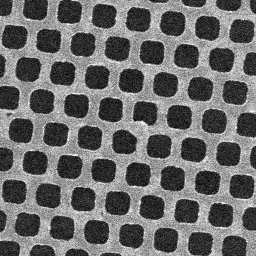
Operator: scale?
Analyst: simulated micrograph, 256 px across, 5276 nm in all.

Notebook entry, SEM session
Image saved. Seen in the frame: a regular array of holes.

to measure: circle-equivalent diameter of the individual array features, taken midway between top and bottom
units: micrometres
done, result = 0.553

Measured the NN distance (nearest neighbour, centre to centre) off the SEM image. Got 712 nm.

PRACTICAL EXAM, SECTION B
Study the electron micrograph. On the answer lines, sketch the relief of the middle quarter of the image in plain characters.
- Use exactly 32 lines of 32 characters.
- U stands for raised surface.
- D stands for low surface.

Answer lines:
DDDUUUDDDDUUUUUUUUUUUUUUUUUUDDDD
DDDUUDDDDDDUUUUDDDDUUUUUUUUUUUUU
DDDUUDDDDDDDUUDDDDDDUUUDDDDDUUUU
DDDUUDDDDDDUUUDDDDDDUUDDDDDDUUUU
DDDUUDDDDDDUUUDDDDDDUUDDDDDDDDUD
DUUUUDDDDDDUUDDDDDDDUUDDDDDDDDUD
UUUUUUUUDDUUUUDDDDDDUUDDDDDDDUUD
UDDDDUUUUUUUUUUDDDUUUUUDDDDDUUUD
DDDDDDUUUUDDDUUDUUUUUUUUUUUUUUUD
DDDDDDUUUDDDDDDUUUDDDDUUUUUUUUUU
DDDDDDUUUDDDDDDUUDDDDDDUUUUDDDDU
DDDDDDUUDDDDDDDUUDDDDDDDUUDDDDDD
DDDDDDUUDDDDDDDUUDDDDDDUUUDDDDDD
UUDDDUUUUDDDDDDUUDDDDDDUUUDDDDDD
UUUUUUUUUUDDDDUUUUDUDDDUUUDDDDDD
DUUUUDDDUUUUUUUUUUUUUDUUUUDDDDDD
DUUUDDDDDUUUUDDDUUUUUUUUUUUUUDUU
DUUDDDDDDDUUDDDDDUUUUUUDDUUUUUUU
DUUDDDDDDDUUDDDDDDUUUDDDDDDUUUDD
DUUDDDDDDDUUDDDDDDUUUDDDDDDUUDDD
UUUDDDDDDUUUDDDDDDUUUDDDDDDUUDDD
UUUUUDDDUUUUDDDDDDUUDDDDDDDUUDDD
DUUUUUUUUUUUUDDDDUUUUDDDDDDUUDDD
DDDDUUUUDDUUUUUUUUUUUUDDDDUUUDDD
DDDDDUUDDDDDDUUUUDUUUUUUUUUUUUUD
DDDDDUUDDDDDDUUUDDDDDUUUUUDDUUUU
DDDDDUUDDDDDDUUDDDDDDDUUDDDDDDUU
DDDDUUUDDDDDDUUDDDDDDDUUDDDDDDUU
DDDDUUUDDDDDDUUDDDDDDDUUDDDDDDUU
UUUUUUUUDDDDUUUDDDDDDDUUDDDDDDDU
UUUUUUUUDUUUUUUUDDDDDUUUDDDDDDUD
UUDDDDDDUUUUUUUUUUUUUUUUUDDDDDUU